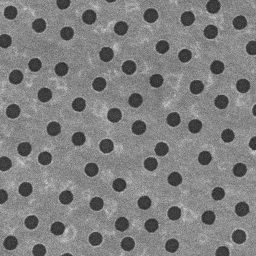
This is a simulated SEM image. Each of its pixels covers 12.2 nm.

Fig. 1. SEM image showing a regular array of holes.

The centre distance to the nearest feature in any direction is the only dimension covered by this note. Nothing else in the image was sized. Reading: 332 nm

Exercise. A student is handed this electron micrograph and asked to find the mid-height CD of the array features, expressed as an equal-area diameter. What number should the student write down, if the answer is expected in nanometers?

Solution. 185